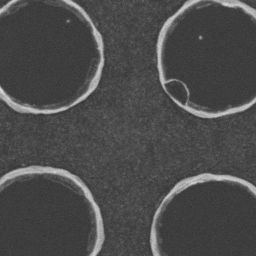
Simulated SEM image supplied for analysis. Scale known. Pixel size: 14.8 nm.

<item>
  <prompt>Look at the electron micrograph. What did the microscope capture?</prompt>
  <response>raised bodies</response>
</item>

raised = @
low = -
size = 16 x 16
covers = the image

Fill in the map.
@@@@@-------@@@-
@@@@@@----@@@@@@
@@@@@@----@@@@@@
@@@@@@----@@@@@@
@@@@@@----@@@@@@
@@@@@@----@@@@@@
-@@@@------@@@@@
----------------
----------------
----------------
----------------
@@@@@------@@@@-
@@@@@@----@@@@@@
@@@@@@----@@@@@@
@@@@@@----@@@@@@
@@@@@@----@@@@@@